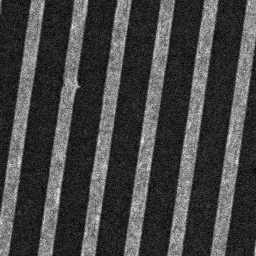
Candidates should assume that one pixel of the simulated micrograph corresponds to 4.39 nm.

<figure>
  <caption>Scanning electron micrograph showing parallel lines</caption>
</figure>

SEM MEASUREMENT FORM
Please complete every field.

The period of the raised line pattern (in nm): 188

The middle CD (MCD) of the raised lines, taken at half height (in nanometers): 56.5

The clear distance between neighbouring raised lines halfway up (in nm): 132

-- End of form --